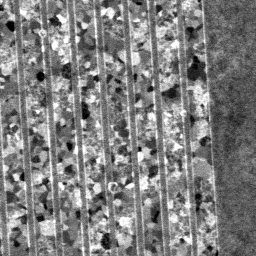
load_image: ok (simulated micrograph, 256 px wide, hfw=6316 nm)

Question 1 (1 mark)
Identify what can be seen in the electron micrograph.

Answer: parallel lines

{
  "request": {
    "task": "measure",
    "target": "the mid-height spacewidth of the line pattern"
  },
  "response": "0.172 µm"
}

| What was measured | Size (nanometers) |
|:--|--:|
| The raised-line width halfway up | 492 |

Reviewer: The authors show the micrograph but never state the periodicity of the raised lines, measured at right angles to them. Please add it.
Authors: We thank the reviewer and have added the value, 0.664 micrometres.